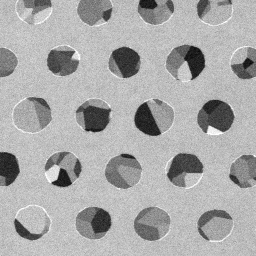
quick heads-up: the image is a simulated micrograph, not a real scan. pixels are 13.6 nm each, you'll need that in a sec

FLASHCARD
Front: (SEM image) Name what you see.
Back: a regular array of raised bodies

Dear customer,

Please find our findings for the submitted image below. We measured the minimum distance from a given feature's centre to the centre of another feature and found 830 nm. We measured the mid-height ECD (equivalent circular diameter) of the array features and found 498 nanometres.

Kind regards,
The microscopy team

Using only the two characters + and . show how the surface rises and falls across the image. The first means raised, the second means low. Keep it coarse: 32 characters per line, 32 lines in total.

..++++....++++...+++++...++++...
..++++....++++...+++++...++++...
...+++....++++....+++....++++...
................................
................................
................................
++....++++....+++....++++....+++
++....++++....++++...+++++...+++
++....++++....++++...+++++...+++
+......+......+++.....+++.....++
................................
................................
...+++.....++......+......+.....
..++++....++++...+++++...++++...
..+++++..+++++...+++++...++++...
..++++....++++...+++++...++++...
...++.............+++....+++....
................................
................................
++....+++.....+++.....+++.....++
++....++++...+++++...++++....+++
++....++++...+++++...++++....+++
++....++++...+++++...++++....+++
...............+.......+......+.
................................
................................
..++++....+++....++++.....++....
..++++...+++++...++++....++++...
..++++...+++++...++++....++++...
...++.....+++....++++....+++....
................................
................................